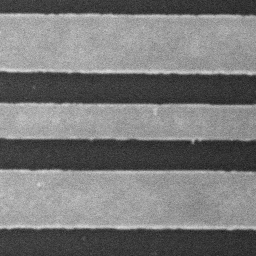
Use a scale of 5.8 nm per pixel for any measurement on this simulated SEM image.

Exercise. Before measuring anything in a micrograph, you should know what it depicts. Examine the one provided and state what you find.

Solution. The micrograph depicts lines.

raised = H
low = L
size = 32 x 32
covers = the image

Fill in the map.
LLLLLLLLLLLLLLLLLLLLLLLLLLLLLLLL
LLLLLLLLLLLLLLLLLLLLLLLLLLLLLLLL
HHHHHHHHHHHHHHHHHHHHHHHHHHHHHHHH
HHHHHHHHHHHHHHHHHHHHHHHHHHHHHHHH
HHHHHHHHHHHHHHHHHHHHHHHHHHHHHHHH
HHHHHHHHHHHHHHHHHHHHHHHHHHHHHHHH
HHHHHHHHHHHHHHHHHHHHHHHHHHHHHHHH
HHHHHHHHHHHHHHHHHHHHHHHHHHHHHHHH
HHHHHHHHHHHHHHHHHHHHHHHHHHHHHHHH
LLLLLLLLLLLLLLLLLLLLLLLLLLLLLLLL
LLLLLLLLLLLLLLLLLLLLLLLLLLLLLLLL
LLLLLLLLLLLLLLLLLLLLLLLLLLLLLLLL
LLLLLLLLLLLLLLLLLLLLLLLLLLLLLLLL
HHHHHHHHHHHHHHHHHHHHHHHHHHHHHHHH
HHHHHHHHHHHHHHHHHHHHHHHHHHHHHHHH
HHHHHHHHHHHHHHHHHHHHHHHHHHHHHHHH
HHHHHHHHHHHHHHHHHHHHHHHHHHHHHHHH
LLLLLLLLLLLLLLLLLLLLLLLLHLLLHLHH
LLLLLLLLLLLLLLLLLLLLLLLLLLLLLLLL
LLLLLLLLLLLLLLLLLLLLLLLLLLLLLLLL
LLLLLLLLLLLLLLLLLLLLLLLLLLLLLLLL
HHHHHHHHHHHHHHHHHHHHHHHHHHHHLHLL
HHHHHHHHHHHHHHHHHHHHHHHHHHHHHHHH
HHHHHHHHHHHHHHHHHHHHHHHHHHHHHHHH
HHHHHHHHHHHHHHHHHHHHHHHHHHHHHHHH
HHHHHHHHHHHHHHHHHHHHHHHHHHHHHHHH
HHHHHHHHHHHHHHHHHHHHHHHHHHHHHHHH
HHHHHHHHHHHHHHHHHHHHHHHHHHHHHHHH
LHLLLLLLLLLLLLHHLLLHLHLHHHHHHHHH
LLLLLLLLLLLLLLLLLLLLLLLLLLLLLLLL
LLLLLLLLLLLLLLLLLLLLLLLLLLLLLLLL
LLLLLLLLLLLLLLLLLLLLLLLLLLLLLLLL